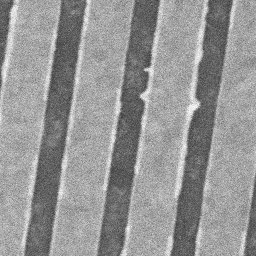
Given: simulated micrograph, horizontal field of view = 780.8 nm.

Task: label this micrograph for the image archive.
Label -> one or a few lines or trenches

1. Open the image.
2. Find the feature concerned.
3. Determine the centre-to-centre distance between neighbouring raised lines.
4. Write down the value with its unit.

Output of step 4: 221 nanometers